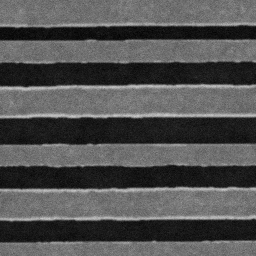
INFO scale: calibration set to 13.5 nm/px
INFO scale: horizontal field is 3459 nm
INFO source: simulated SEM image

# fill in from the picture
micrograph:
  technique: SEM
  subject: lines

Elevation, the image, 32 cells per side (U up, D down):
UUUUUUUUUUUUUUUUUUUUUUUUUUUUUUUU
UUUUUUUUUUUUUUUUUUUUUUUUUUUUUUUU
UUUUUUUUUUUUUUUUUUUUUUUUUUUUUUUU
DDDDDDDDDDDDDDDDDDDDDDDDDDDDDDDD
DDDDDDDDDDDDDDDDDDDDDDDDDDDDDDDD
UUUUUUUUUUUUUUUUUUUUUUUUUUUUUUUU
UUUUUUUUUUUUUUUUUUUUUUUUUUUUUUUU
UUUUUUUUUUUUUUUUUUUUUUUUUUUUUUUU
DDDDDDDDDDDDDDDDDDDDDDDDDDDDDDDD
DDDDDDDDDDDDDDDDDDDDDDDDDDDDDDDD
DDDDDDDDDDDDDDDDDDDDDDDDDDDDDDDD
UUUUUUUUUUUUUUUUUUUUUUUUUUUUUUUU
UUUUUUUUUUUUUUUUUUUUUUUUUUUUUUUU
UUUUUUUUUUUUUUUUUUUUUUUUUUUUUUUU
UUUUDDDDDDDDDDDDDDDDDDDDDDDDDDDD
DDDDDDDDDDDDDDDDDDDDDDDDDDDDDDDD
DDDDDDDDDDDDDDDDDDDDDDDDDDDDDDDD
DDDDDDDDDDDDDDDDDDDDDDDDDDDDDDDD
UUUUUUUUUUUUUUUUUUUUUUUUUUUUUUUU
UUUUUUUUUUUUUUUUUUUUUUUUUUUUUUUU
UUUUUUUUUUUUUUUUUUUUUUUUUUUUUUUU
DDDDDDDDDDDDDDDDDDDDDDDDDDDDDDDD
DDDDDDDDDDDDDDDDDDDDDDDDDDDDDDDD
DDDDDDDDDDDDDDDDDDDDDDDDDDDDDDDD
UUUUUUUUUUUUUUUUUUUUUUUUUUUUUUUU
UUUUUUUUUUUUUUUUUUUUUUUUUUUUUUUU
UUUUUUUUUUUUUUUUUUUUUUUUUUUUUUUU
DDDDDDDDDDDDDDDDDDDDDDDDDDDDDDDD
DDDDDDDDDDDDDDDDDDDDDDDDDDDDDDDD
DDDDDDDDDDDDDDDDDDDDDDDDDDDDDDDD
UUUUUUUUUUUUUUUUUUUUUUUUUUUUUUUU
UUUUUUUUUUUUUUUUUUUUUUUUUUUUUUUU